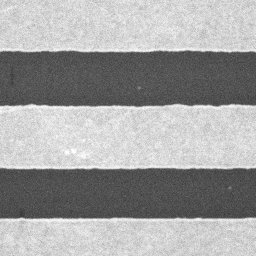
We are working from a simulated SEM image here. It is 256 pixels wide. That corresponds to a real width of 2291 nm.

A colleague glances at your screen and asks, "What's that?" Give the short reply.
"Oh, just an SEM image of lines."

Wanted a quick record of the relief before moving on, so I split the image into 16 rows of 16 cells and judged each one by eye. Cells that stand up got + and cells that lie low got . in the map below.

++++++++++++++++
++++++++++++++++
++++++++++++++++
................
................
................
................
++++++++++++++++
++++++++++++++++
++++++++++++++++
+++++++++..+++++
................
................
................
++++++++++++++++
++++++++++++++++